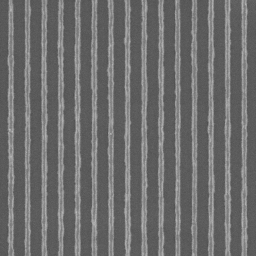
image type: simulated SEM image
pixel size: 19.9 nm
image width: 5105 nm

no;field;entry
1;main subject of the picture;parallel lines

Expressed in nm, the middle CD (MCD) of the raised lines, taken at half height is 74.8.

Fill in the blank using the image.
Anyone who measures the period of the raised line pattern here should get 0.333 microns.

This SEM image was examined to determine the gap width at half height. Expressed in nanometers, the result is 257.